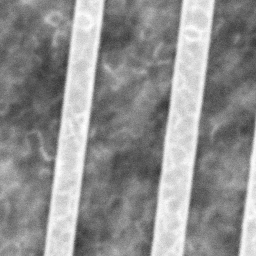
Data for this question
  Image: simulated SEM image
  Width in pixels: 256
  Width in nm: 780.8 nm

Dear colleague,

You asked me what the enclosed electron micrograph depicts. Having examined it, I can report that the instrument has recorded one or a few lines or trenches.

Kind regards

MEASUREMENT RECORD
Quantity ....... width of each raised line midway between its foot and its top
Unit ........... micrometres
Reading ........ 0.0805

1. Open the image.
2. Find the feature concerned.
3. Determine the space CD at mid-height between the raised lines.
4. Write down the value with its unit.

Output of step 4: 0.249 um